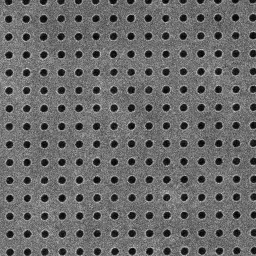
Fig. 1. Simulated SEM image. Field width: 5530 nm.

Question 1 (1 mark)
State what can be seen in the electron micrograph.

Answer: a regular array of holes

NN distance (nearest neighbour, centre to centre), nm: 374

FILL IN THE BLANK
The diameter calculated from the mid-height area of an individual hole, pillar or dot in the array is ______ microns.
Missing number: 0.174